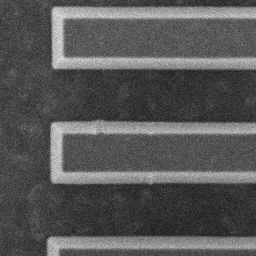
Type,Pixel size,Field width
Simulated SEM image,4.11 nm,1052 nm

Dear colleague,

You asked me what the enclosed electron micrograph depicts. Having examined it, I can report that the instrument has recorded one or a few lines or trenches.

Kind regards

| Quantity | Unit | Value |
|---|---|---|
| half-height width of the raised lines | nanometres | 218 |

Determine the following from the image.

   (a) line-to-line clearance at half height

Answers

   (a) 257 nm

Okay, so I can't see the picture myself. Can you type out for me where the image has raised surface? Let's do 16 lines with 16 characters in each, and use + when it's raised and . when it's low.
................
....++++++++++++
....++++++++++++
....++++++++++++
................
................
................
................
...+++++++++++++
...+++++++++++++
...+++++++++++++
................
................
................
................
...+++++++++++++